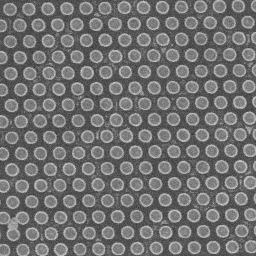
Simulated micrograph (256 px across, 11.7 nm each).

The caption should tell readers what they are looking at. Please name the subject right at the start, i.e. a regular array of raised bodies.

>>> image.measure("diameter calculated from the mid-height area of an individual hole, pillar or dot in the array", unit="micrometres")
0.141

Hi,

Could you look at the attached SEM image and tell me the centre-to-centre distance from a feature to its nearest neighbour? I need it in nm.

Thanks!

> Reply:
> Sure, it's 216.